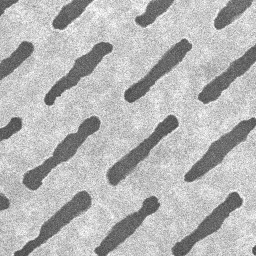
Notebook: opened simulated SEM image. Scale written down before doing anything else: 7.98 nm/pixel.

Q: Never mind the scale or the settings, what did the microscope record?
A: holes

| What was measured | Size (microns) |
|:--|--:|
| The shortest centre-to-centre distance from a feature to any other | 0.637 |